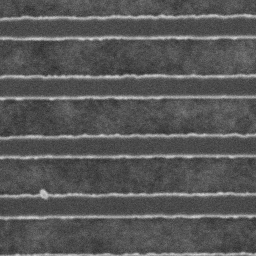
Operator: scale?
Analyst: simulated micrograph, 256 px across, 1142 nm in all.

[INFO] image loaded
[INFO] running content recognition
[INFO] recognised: lines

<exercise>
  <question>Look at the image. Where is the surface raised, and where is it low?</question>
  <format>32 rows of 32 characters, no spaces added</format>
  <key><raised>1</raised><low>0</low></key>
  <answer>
00000000000000000000000000000000
00000000000000000000000000000000
11111111111111111111111111111111
11111111111111111111111111111111
11111111111111111111111111111111
00000000000000000000000000000000
00000000000000000000000000000000
00000000000000000000000000000000
00000000000000000000000000000000
00000000000000011011100010000111
11111111111111111111111111111111
11111111111111111111111111111111
00000000000000000000000000000000
00000000000000000000000000000000
00000000000000000000000000000000
00000000000000000000000000000000
00000000000000000000000000000000
11111111111111111111111111111111
11111111111111111111111111111111
11111111111111111111111111111111
00000000000000000000000000000000
00000000000000000000000000000000
00000000000000000000000000000000
00000000000000000000000000000000
11111111111111111111111111111111
11111111111111111111111111111111
11111111111111111111111111111111
00000000000000000000000000000000
00000000000000000000000000000000
00000000000000000000000000000000
00000000000000000000000000000000
00000000000000000000000000000000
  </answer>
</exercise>